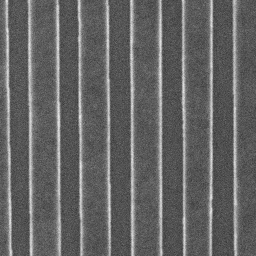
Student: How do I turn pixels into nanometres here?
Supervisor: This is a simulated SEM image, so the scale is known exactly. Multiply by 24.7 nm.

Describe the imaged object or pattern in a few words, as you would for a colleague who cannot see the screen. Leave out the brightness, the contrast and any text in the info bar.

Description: lines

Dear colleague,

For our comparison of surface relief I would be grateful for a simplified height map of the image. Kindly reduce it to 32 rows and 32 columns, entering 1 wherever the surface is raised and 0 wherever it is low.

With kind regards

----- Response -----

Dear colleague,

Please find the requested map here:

10001110001110001111000111000111
10001110001110001111000111000111
10001110001111001111000111000111
10001110001111001111000111000111
10001110001111001111000111000111
10001110001111001111000111000111
10001110001111001111000111000111
10001110001111001111000111000111
10001110001111001111000111000111
10001110001111001111000111000111
10001110001111001111000111000111
10001110001111001111000111000111
10001110001111001111000111000111
10001110001111001111000111000111
10001110001111001111000111000111
10001110001111001111000111000111
10001110001111001111000111000111
10001110001111001111000111000111
10001110001111001111000111000111
10001110001111001111000111000111
10001110001111000111000111000111
10001110001111000111000111000111
10001110001111000111000111000111
10001110001111000111000111000111
10001110001111000111000111000111
10001110001111000111000111000111
10001110001111000111000111000111
10001110001111000111000111000111
10001110001111000111000111000111
10001110001111000111000111000111
10001110001111000111000111000111
10001110001111000111000111000111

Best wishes